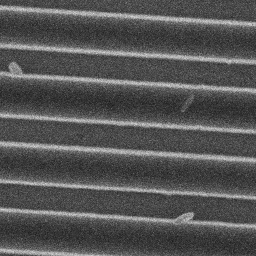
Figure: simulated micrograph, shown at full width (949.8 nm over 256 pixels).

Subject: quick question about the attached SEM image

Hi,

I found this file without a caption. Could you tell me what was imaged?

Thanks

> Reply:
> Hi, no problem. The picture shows one or a few lines or trenches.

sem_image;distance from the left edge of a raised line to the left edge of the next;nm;251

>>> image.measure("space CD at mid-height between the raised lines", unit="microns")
0.0969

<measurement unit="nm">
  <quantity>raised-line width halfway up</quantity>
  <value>149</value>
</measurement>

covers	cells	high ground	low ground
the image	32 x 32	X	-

--------------------------------
XXXXXXXXXX----------------------
XXXXXXXXXXXXXXXXXXXXXXXXX-------
XXXXXXXXXXXXXXXXXXXXXXXXXXXXXXXX
XXXXXXXXXXXXXXXXXXXXXXXXXXXXXXXX
XXXXXXXXXXXXXXXXXXXXXXXXXXXXXXXX
----------XXXXXXXXXXXXXXXXXXXXXX
--------------------------XXXXXX
-X------------------------------
XXXXX---------------------------
XXXXXXXXXXXXXXXXXXXXX-----------
XXXXXXXXXXXXXXXXXXXXXXXXXXXXXXXX
XXXXXXXXXXXXXXXXXXXXXXXXXXXXXXXX
XXXXXXXXXXXXXXXXXXXXXXXXXXXXXXXX
-XXXXXXXXXXXXXXXXXXXXXXXXXXXXXXX
---------------XXXXXXXXXXXXXXXXX
-------------------------------X
--------------------------------
XXXXXXXXXX----------------------
XXXXXXXXXXXXXXXXXXXXXXXX--------
XXXXXXXXXXXXXXXXXXXXXXXXXXXXXXXX
XXXXXXXXXXXXXXXXXXXXXXXXXXXXXXXX
XXXXXXXXXXXXXXXXXXXXXXXXXXXXXXXX
------------XXXXXXXXXXXXXXXXXXXX
---------------------------XXXXX
--------------------------------
XXXXX---------------------------
XXXXXXXXXXXXXXXXXXXX--XX--------
XXXXXXXXXXXXXXXXXXXXXXXXXXXXXXXX
XXXXXXXXXXXXXXXXXXXXXXXXXXXXXXXX
XXXXXXXXXXXXXXXXXXXXXXXXXXXXXXXX
--XXXXXXXXXXXXXXXXXXXXXXXXXXXXXX